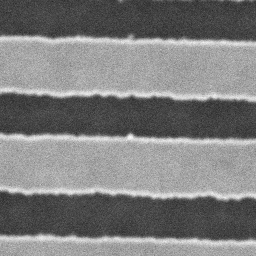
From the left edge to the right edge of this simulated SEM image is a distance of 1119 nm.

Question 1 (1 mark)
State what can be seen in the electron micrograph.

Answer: lines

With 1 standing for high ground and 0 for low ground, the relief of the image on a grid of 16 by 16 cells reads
0000000000000000
0000000000000000
1111111001000000
1111111111111111
1111111111111111
1111111111111111
0000000000000000
0000000000000000
1010000000000000
1111111111111111
1111111111111111
1111111111111111
0000000000000000
0000000000000000
0000000000000000
1111111111111111